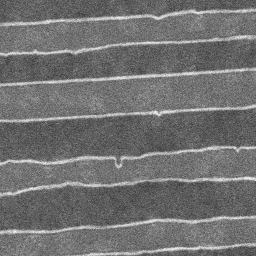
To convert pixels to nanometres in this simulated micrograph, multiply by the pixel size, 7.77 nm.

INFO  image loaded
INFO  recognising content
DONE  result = one or a few lines or trenches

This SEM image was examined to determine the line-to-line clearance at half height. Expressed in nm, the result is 228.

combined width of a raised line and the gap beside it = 553 nm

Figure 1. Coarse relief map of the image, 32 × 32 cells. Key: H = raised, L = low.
HHHHHHHHHHHHHHHHHHHHHHHHHHHHHHHH
HHHHHHHHHHHHHHHHHHHHHHHLHHLLLLLL
HHHHHHHHHHLLLLLLLLLLLLLLLLLLLLLL
LLLLLLLLLLLLLLLLLLLLLLLLLLLLLLLL
LLLLLLLLLLLLLLLLLLLLLLLLLLLLLLLL
LLLLLLLLLLLLLLLLLHHHHHHHHHHHHHHH
LLLLLLLLHLHHHHHHHHHHHHHHHHHHHHHH
HHHHHHHHHHHHHHHHHHHHHHHHHHHHHHHH
HHHHHHHHHHHHHHHHHHHHHHHHHHHHHHHH
HHHHHHHHHHHHHHHHHHHLLLLLLLLLLLLL
HLLLLLLLLLLLLLLLLLLLLLLLLLLLLLLL
LLLLLLLLLLLLLLLLLLLLLLLLLLLLLLLL
LLLLLLLLLLLLLLLLLLLLLLLLLLLLLLLL
LLLLLLLLLLLLLLLLLLLLLLLLLLLLLLHH
LLLLLLLLLLLLLHHHHHHHHHHHHHHHHHHH
HHHHHHHHHHHHHHHHHHHHHHHHHHHHHHHH
HHHHHHHHHHHHHHHHHHHHHHHHHHHHHHHH
HHHHHHHHHHHHHHHHHHHHHHHHHHHHHHHH
HHHHHHHHHHHHHHHHHHHHHHHHHHHLLHLL
HHHHHHHHHHHHHHHHHHLLLLLLLLLLLLLL
LLLLLLLLLLLLLLLLLLLLLLLLLLLLLLLL
LLLLLLLLLLLLLLLLLLLLLLLLLLLLLLLL
LLLLLLLLLLLLLLLLLLLLHHHLLHHHHHHH
LLLLLHHHHHHHHHHHHHHHHHHHHHHHHHHH
HHHHHHHHHHHHHHHHHHHHHHHHHHHHHHHH
HHHHHHHHHHHHHHHHHHHHHHHHHHHHHHHH
HHHHHHHHHHHHHHHHHHHHHHHHHHHHHHHH
HHHHHHHHHHHHHHHHHHHHHHHHHHLLLLLL
HHHHHHHHHHLLLLLLLLLLLLLLLLLLLLLL
LLLLLLLLLLLLLLLLLLLLLLLLLLLLLLLL
LLLLLLLLLLLLLLLLLLLLLLLLLLLLLLLL
LLLLLLLLLLLLLLLLLLHHHHHHHHHHHHHH